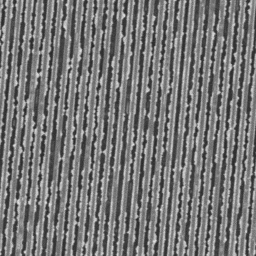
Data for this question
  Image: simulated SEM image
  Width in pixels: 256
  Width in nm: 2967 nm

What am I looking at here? parallel lines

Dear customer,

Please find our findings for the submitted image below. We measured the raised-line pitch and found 117 nm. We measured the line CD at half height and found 75.1 nm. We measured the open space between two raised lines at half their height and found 43.3 nanometers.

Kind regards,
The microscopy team